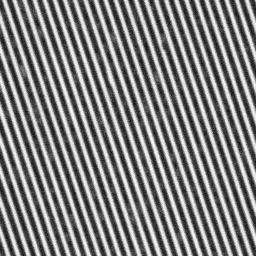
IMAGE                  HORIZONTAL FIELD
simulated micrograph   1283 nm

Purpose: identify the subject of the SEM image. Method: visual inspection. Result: parallel lines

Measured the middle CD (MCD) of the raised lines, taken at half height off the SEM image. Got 0.0136 µm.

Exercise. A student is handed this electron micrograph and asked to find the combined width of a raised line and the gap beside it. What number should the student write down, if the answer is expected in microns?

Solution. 0.048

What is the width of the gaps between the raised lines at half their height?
0.0315 um